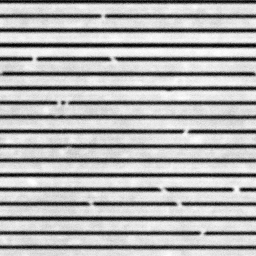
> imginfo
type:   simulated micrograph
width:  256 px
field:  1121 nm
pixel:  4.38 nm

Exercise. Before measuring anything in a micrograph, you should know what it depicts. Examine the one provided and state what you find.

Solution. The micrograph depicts parallel lines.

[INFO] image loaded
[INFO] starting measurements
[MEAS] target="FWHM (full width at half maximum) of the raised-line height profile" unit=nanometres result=46.6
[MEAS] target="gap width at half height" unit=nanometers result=15.9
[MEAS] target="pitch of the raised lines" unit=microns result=0.0634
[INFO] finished